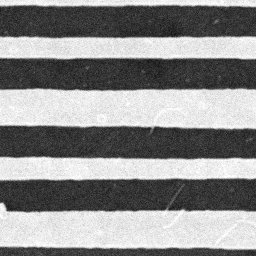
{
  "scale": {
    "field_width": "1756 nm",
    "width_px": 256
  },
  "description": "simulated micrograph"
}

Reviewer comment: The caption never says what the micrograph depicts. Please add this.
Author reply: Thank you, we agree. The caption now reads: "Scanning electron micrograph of lines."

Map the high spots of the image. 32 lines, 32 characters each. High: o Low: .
oooooooooooooooooooooooooooooooo
................................
................................
................................
................................
oooooooooooooooooooooooooooooooo
oooooooooooooooooooooooooooooooo
................................
................................
................................
................................
oooooooooooooooooooooooooooooooo
oooooooooooooooooooooooooooooooo
oooooooooooooooooooooooooooooooo
oooooooooooooooooooooooooooooooo
oooooooooooooooooooooooooooooooo
................................
................................
................................
................................
oooooooooooooooooooooooooooooooo
oooooooooooooooooooooooooooooooo
................................
................................
................................
................................
o.......ooooo.ooooooooooooooooo.
oooooooooooooooooooooooooooooooo
oooooooooooooooooooooooooooooooo
oooooooooooooooooooooooooooooooo
oooooooooooooooooooooooooooooooo
................................